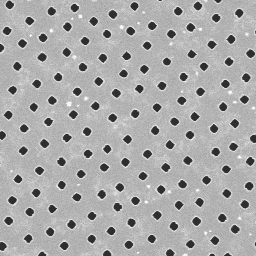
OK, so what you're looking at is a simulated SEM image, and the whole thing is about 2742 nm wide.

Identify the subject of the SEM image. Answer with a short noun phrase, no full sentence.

a regular array of holes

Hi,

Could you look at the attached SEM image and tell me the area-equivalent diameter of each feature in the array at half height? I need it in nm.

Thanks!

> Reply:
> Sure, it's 87.1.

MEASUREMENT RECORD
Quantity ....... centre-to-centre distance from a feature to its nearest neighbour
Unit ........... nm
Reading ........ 224